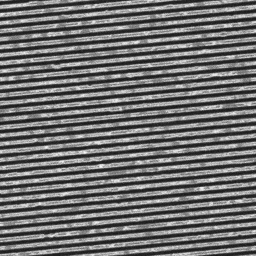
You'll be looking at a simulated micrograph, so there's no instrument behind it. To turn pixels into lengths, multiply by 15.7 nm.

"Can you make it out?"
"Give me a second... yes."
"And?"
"parallel lines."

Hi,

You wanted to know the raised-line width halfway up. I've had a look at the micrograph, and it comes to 60.4 nm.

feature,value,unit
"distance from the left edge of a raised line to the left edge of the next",126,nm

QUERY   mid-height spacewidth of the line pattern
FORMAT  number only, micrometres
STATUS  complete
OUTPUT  0.0585